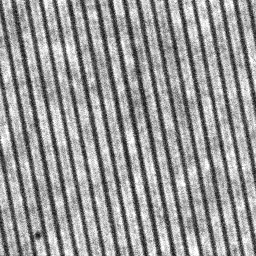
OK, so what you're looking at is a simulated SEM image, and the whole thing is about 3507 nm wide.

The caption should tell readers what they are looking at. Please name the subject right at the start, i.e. parallel lines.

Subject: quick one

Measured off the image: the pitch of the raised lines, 186 nm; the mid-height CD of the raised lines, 95.8 nanometers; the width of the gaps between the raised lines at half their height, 0.0857 µm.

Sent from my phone